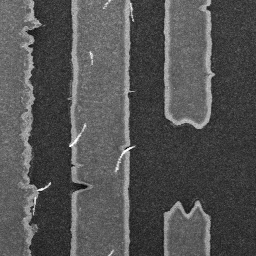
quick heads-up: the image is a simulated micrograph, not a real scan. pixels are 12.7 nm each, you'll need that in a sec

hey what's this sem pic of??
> one or a few lines or trenches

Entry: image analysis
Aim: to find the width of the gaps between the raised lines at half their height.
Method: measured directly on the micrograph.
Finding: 0.556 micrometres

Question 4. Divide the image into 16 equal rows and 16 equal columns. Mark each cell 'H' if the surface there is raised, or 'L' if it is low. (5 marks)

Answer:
HHLLLHHHLLHHHLLL
HHLLLHHHLLHHHLLL
HHLLLHHHLLHHHLLL
HHLLLHHHLLHHHLLL
HHLLLHHHLLHHHLLL
HHLLLHHHLLHHHLLL
HHLLLHHHLLHHHLLL
HHLLLHHHLLLHHLLL
HHLLLHHHLLLLLLLL
HHLLLHHHLLLLLLLL
HHLLLHHHLLLLLLLL
HHLLLHHHLLLLLLLL
HHLLLHHHLLLLLLLL
HHLLLHHHLLLHHLLL
HHLLLHHHLLHHHLLL
HHLLLHHHLLHHHLLL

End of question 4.